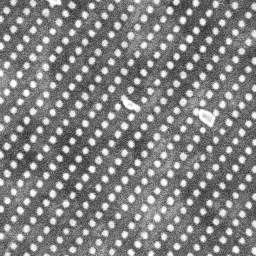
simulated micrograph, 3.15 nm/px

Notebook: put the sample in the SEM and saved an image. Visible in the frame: a regular array of raised bodies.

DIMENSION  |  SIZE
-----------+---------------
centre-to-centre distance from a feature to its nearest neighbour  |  10.7 pixels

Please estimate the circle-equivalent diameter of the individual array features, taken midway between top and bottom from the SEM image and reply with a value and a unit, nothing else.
17.1 nanometres